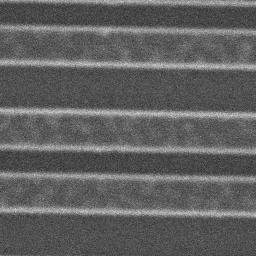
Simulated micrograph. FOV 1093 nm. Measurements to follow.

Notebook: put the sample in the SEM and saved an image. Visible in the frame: one or a few lines or trenches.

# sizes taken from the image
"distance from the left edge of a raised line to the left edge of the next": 314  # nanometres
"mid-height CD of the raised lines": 158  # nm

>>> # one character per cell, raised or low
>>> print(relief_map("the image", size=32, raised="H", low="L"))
LLLLLLLLLLLLLLLLLLLLLLLLLLLLLLLL
LLLLLLLLLLLLLLLLLLLLLLLLLLLLLLLL
LLLLLLLLLLLLLLLLLLLLLLLLLLLLLLLL
HHHHLLLLLLLLLLLLLLLLLLLLLLLLLLLL
HHHHHHHHHHHHHHHHHHHHHHHHHHHHHHHH
HHHHHHHHHHHHHHHHHHHHHHHHHHHHHHHH
HHHHHHHHHHHHHHHHHHHHHHHHHHHHHHHH
HHHHHHHHHHHHHHHHHHHHHHHHHHHHHHHH
LLLLLLLLLLLLLLLLLLLLLLLLLLLLLLLL
LLLLLLLLLLLLLLLLLLLLLLLLLLLLLLLL
LLLLLLLLLLLLLLLLLLLLLLLLLLLLLLLL
LLLLLLLLLLLLLLLLLLLLLLLLLLLLLLLL
LLLLLLLLLLLLLLLLLLLLLLLLLLLLLLLL
LLLLLLLLLLLLLLLLLLLLLLLLLLLLLLLL
HHHHHHHHHHHHHHHHHHHHHHHHHHHHHHHH
HHHHHHHHHHHHHHHHHHHHHHHHHHHHHHHH
HHHHHHHHHHHHHHHHHHHHHHHHHHHHHHHH
HHHHHHHHHHHHHHHHHHHHHHHHHHHHHHHH
LLLLLLLHHHHHHHHHHHHHHHHHHHHHHHHH
LLLLLLLLLLLLLLLLLLLLLLLLLLLLLLLL
LLLLLLLLLLLLLLLLLLLLLLLLLLLLLLLL
LLLLLLLLLLLLLLLLLLLLLLLLLLLLLLLL
HHHHHHHHHHHHHHHHHHHHHHHHHHHHHHHH
HHHHHHHHHHHHHHHHHHHHHHHHHHHHHHHH
HHHHHHHHHHHHHHHHHHHHHHHHHHHHHHHH
HHHHHHHHHHHHHHHHHHHHHHHHHHHHHHHH
LLLLLLLLLLHLHHHHHHHHHHHHHHHHHHHH
LLLLLLLLLLLLLLLLLLLLLLLLLLLLLLLL
LLLLLLLLLLLLLLLLLLLLLLLLLLLLLLLL
LLLLLLLLLLLLLLLLLLLLLLLLLLLLLLLL
LLLLLLLLLLLLLLLLLLLLLLLLLLLLLLLL
LLLLLLLLLLLLLLLLLLLLLLLLLLLLLLLL